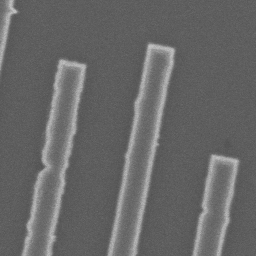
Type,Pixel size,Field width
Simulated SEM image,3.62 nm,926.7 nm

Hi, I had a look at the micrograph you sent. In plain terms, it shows one or a few lines or trenches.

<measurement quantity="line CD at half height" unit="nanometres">86.4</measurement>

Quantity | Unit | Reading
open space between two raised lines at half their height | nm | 216